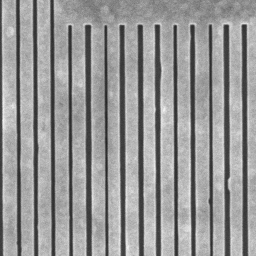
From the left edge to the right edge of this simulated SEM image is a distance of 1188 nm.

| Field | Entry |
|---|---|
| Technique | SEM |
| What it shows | parallel lines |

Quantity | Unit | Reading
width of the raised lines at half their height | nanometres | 59.1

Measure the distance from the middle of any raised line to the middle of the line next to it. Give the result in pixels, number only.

17.4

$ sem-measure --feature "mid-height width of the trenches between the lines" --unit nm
22.6